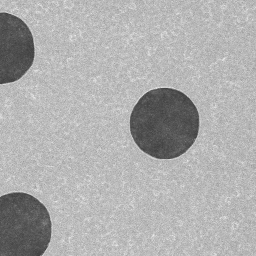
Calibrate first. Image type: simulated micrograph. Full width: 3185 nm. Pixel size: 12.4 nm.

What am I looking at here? holes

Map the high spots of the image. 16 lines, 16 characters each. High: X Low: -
XXXXXXXXXXXXXXXX
--XXXXXXXXXXXXXX
--XXXXXXXXXXXXXX
--XXXXXXXXXXXXXX
--XXXXXXXXXXXXXX
XXXXXXXXXXXXXXXX
XXXXXXXXX---XXXX
XXXXXXXX----XXXX
XXXXXXXX----XXXX
XXXXXXXXX---XXXX
XXXXXXXXXXXXXXXX
XXXXXXXXXXXXXXXX
--XXXXXXXXXXXXXX
---XXXXXXXXXXXXX
---XXXXXXXXXXXXX
---XXXXXXXXXXXXX